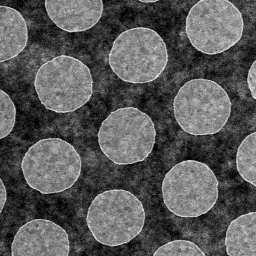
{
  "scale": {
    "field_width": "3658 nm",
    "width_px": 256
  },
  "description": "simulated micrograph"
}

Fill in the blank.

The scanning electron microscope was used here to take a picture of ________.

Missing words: raised bodies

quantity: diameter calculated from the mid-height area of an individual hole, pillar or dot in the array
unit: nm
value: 808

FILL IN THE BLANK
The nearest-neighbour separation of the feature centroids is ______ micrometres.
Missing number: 1.14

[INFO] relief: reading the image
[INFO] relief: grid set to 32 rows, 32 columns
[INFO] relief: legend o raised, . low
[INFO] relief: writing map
......ooooooo............oooo...
oo....ooooooo...........oooooo..
ooo....ooooo...........ooooooo..
ooo.....ooo............ooooooo..
ooo............ooooo...ooooooo..
ooo...........ooooooo...ooooo...
oo............ooooooo....ooo....
o.....oooo....ooooooo...........
.....oooooo...oooooo...........o
.....oooooo....ooooo...........o
....oooooooo...........oooo....o
.....oooooo...........oooooo...o
o....oooooo...........ooooooo...
oo....oooo......o.....ooooooo...
oo............oooo....ooooooo...
oo...........oooooo...oooooo....
o...........ooooooo....oooo.....
.....ooo....ooooooo............o
....ooooo....oooooo...........oo
...ooooooo...ooooo............oo
...ooooooo.....o......ooo.....oo
...ooooooo...........oooooo...oo
...oooooo...........ooooooo....o
o...oooo............ooooooo.....
o...........ooooo...ooooooo.....
...........ooooooo...oooooo.....
...........ooooooo....oooo......
....oo.....ooooooo...........ooo
...ooooo...ooooooo...........ooo
..oooooo....ooooo...........oooo
..ooooooo....oo......ooo....oooo
..ooooooo...........ooooo...oooo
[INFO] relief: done